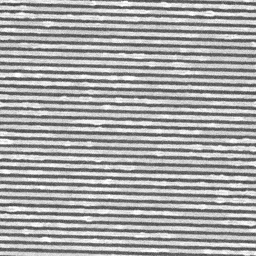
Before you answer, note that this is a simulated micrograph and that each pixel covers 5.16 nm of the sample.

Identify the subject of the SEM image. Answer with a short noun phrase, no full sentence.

parallel lines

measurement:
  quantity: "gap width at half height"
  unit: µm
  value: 0.0213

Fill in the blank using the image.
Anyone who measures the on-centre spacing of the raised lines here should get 38.4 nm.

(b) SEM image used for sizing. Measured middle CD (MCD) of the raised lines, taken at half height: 17.4 nm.